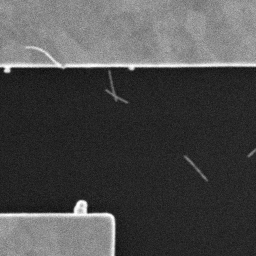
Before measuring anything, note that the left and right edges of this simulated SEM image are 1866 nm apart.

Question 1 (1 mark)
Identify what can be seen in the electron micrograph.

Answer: wiring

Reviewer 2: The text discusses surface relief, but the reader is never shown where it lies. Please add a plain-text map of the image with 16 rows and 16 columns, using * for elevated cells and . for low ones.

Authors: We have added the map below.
****************
****************
****************
****************
................
................
................
................
................
................
................
................
................
*******.........
*******.........
*******.........